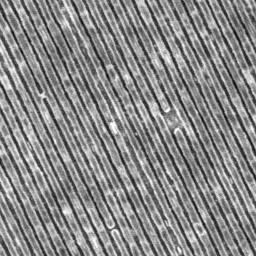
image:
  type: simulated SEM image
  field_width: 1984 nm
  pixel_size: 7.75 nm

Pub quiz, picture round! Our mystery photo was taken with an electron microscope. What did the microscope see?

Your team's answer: parallel lines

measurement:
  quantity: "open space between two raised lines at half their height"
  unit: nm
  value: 29.7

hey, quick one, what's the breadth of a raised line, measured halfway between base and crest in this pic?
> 0.0516 um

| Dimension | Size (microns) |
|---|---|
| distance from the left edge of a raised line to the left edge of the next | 0.086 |